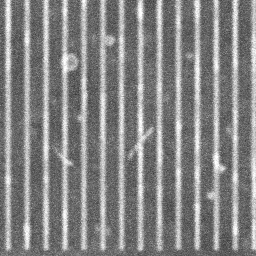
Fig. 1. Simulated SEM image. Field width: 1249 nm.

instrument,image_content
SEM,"parallel lines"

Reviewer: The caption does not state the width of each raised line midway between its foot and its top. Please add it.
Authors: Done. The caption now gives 13.4 nm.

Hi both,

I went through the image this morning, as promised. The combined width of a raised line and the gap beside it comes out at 18.9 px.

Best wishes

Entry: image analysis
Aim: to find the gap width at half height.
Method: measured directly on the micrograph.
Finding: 77.4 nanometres